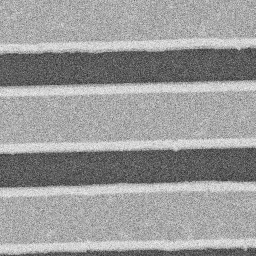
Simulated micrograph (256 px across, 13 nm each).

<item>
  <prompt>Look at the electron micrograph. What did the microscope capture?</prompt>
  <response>one or a few lines or trenches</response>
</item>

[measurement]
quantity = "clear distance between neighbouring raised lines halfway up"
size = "583 nanometers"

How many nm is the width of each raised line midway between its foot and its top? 718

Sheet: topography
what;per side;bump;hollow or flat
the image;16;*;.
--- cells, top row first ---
****************
****************
****************
................
................
..............**
****************
****************
****************
................
................
................
****************
****************
****************
*...............